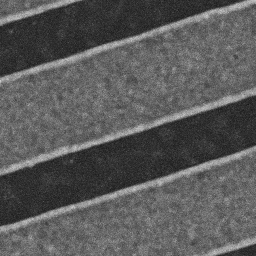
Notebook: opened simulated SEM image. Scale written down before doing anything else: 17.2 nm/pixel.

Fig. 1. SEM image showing one or a few lines or trenches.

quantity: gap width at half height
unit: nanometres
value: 952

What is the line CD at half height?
1500 nanometers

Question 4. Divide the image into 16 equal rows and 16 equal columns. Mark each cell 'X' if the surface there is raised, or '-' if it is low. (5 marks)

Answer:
XXX-----------XX
-----------XXXXX
--------XXXXXXXX
-----XXXXXXXXXXX
--XXXXXXXXXXXXXX
XXXXXXXXXXXXXXXX
XXXXXXXXXXXXXX--
XXXXXXXXXX------
XXXXXXX---------
XXXX-----------X
X-----------XXXX
---------XXXXXXX
------XXXXXXXXXX
---XXXXXXXXXXXXX
XXXXXXXXXXXXXXXX
XXXXXXXXXXXXXX--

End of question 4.